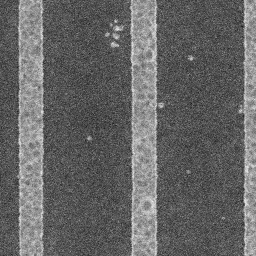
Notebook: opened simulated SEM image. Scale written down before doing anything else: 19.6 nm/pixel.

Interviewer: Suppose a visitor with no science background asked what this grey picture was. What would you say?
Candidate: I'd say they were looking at one or a few lines or trenches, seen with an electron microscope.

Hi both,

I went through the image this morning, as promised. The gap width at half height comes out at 1.76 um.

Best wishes